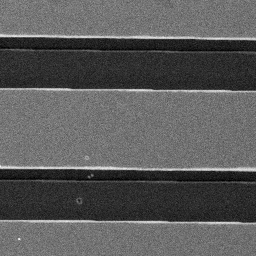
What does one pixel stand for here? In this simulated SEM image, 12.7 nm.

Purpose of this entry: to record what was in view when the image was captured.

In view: lines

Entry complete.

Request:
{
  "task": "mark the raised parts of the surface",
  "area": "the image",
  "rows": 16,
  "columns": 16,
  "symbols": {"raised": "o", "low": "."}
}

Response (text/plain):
oooooooooooooooo
oooooooooooooooo
................
................
................
................
oooooooooooooooo
oooooooooooooooo
oooooooooooooooo
oooooooooooooooo
oooooooooooooooo
................
................
................
oooooooooooooooo
oooooooooooooooo